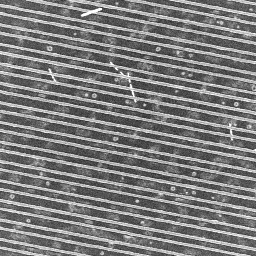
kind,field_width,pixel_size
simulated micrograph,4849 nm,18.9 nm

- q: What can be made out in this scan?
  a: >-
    parallel lines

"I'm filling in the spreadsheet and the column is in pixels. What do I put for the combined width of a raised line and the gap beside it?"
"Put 9.56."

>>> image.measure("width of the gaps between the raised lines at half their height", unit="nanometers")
116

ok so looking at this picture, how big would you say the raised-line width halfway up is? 2.46 px